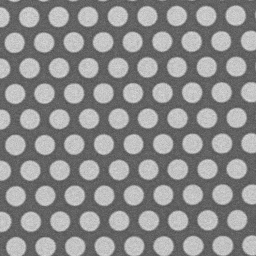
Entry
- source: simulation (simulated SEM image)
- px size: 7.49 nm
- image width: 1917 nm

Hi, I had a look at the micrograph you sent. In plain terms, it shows an array of small figures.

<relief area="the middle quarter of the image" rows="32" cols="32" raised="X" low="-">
X---XXXX---XXXXX---XXXX---XXXXX-
X---XXXX---XXXXX---XXXX---XXXXX-
X---XXXX----XXX----XXXX----XXX--
--------------------------------
--------------------------------
-XXX----XXXX----XXX----XXX----XX
XXXXX---XXXX---XXXXX--XXXXX---XX
XXXXX---XXXX---XXXXX--XXXXX---XX
XXXXX---XXXX---XXXX----XXXX---XX
-XXX-----XX-----XX------X------X
--------------------------------
-----XX------XX-----XX-----XXX--
X---XXXX----XXXX---XXXX---XXXXX-
X---XXXXX--XXXXX---XXXX---XXXXX-
X---XXXXX--XXXXX---XXXX---XXXXX-
X----XXX----XXX-----XX-----XXX--
--------------------------------
--------------------------------
-XXX----XXXX----XXX----XXXX---XX
XXXXX---XXXX---XXXXX--XXXXX---XX
XXXXX---XXXX---XXXXX--XXXXX---XX
-XXXX---XXXX---XXXX----XXXX---XX
---------XX---------------------
--------------------------------
-----XXX----XXX-----XXX----XXX--
X---XXXX----XXXX---XXXX---XXXXX-
X---XXXXX--XXXXX---XXXX---XXXXX-
X---XXXX----XXXX---XXXX---XXXXX-
-----XXX----XXX-----XX-----XXX--
--------------------------------
-----------------X------XX-----X
-XXXX---XXXX---XXXXX---XXXX---XX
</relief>